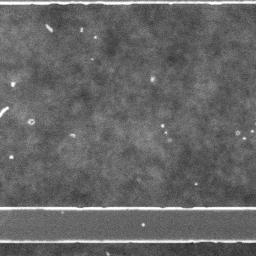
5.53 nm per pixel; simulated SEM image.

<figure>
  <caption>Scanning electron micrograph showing lines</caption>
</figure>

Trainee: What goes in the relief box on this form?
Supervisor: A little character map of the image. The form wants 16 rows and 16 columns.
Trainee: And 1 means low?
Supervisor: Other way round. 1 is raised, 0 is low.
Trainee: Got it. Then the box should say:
0000000000000000
0000000000000000
0000000000000000
0000000000000000
0000000000000000
0000000000000000
0000000000000000
0000000000000000
0000000000000000
0000000000000000
0000000000000000
0000000000000000
0000000000000000
1111111111111111
1111111111111111
0000000000000000